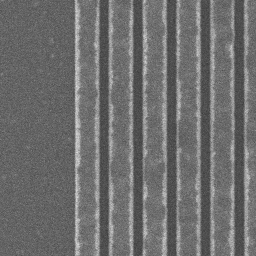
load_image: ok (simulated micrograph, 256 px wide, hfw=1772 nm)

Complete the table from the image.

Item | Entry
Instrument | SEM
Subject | parallel lines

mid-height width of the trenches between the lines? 72.7 nm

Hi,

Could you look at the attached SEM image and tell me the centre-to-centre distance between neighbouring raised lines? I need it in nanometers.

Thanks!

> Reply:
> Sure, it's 234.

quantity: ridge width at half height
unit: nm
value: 158